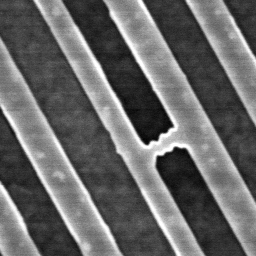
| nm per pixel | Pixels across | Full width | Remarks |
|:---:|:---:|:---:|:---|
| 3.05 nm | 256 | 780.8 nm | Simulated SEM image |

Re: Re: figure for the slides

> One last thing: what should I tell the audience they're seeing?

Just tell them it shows one or a few lines or trenches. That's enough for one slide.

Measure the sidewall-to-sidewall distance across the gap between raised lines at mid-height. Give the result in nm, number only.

116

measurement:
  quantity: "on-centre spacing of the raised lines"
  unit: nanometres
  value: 213